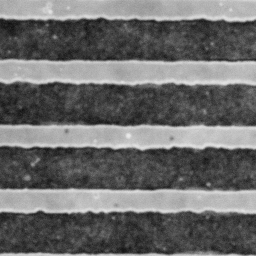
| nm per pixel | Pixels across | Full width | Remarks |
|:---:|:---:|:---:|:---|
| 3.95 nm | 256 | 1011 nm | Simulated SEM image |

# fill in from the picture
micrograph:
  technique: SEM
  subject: lines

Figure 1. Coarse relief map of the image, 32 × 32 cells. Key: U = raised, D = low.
UUUUUUUUUUUUUUUUUUUUUUUUUUUUUUUU
UUUUUUUUUUUUUUUUUUUUUUUUUUUUUUUU
DDDDDDDUDDDDDDDDDDDUUUUDDDUDUUUU
DDDDDDDDDDDDDDDDDDDDDDDDDDDDDDDD
DDDDDDDDDDDDDDDDDDDDDDDDDDDDDDDD
DDDDDDDDDDDDDDDDDDDDDDDDDDDDDDDD
DDDDDDDDDDDDDDDDDDDDDDDDDDDDDDDD
UUUDDDDDDDDDDDDDDDDDDDDDDDDDDDDD
UUUUUUUUUUUUUUUUUUUUUUUUUUUUUUUU
UUUUUUUUUUUUUUUUUUUUUUUUUUUUUUUU
DDDDUDDDDUDDDDUUUUDUDDUUUUUUUDDU
DDDDDDDDDDDDDDDDDDDDDDDDDDDDDDDD
DDDDDDDDDDDDDDDDDDDDDDDDDDDDDDDD
DDDDDDDDDDDDDDDDDDDDDDDDDDDDDDDD
DDDDDDDDDDDDDDDDDDDDDDDDDDDDDDDD
DDDDDDDDDDDDDDDDDDDDDDDDDDDDDDDD
UUUUUUUUUUUUUUUUUUUUUUUUUUUUUUUU
UUUUUUUUUUUUUUUUUUUUUUUUUUUUUUUU
DDDDDDDDDDDDDDUDDUUDUDDDUUDDUUDU
DDDDDDDDDDDDDDDDDDDDDDDDDDDDDDDD
DDDDDDDDDDDDDDDDDDDDDDDDDDDDDDDD
DDDDDDDDDDDDDDDDDDDDDDDDDDDDDDDD
DDDDDDDDDDDDDDDDDDDDDDDDDDDDDDDD
DDDDDDDDDDDDDDDDDDDDDDDDDDDDDDDD
UUUUUUUUUUUUUUUUUUUUUUUUUUUUUUUU
UUUUUUUUUUUUUUUUUUUUUUUUUUUUUUUU
DUUUDDUUUDUDDUDDDDDDUUDDUDDDDDUU
DDDDDDDDDDDDDDDDDDDDDDDDDDDDDDDD
DDDDDDDDDDDDDDDDDDDDDDDDDDDDDDDD
DDDDDDDDDDDDDDDDDDDDDDDDDDDDDDDD
DDDDDDDDDDDDDDDDDDDDDDDDDDDDDDDD
DDDDDDDDDDDDDDDDDDDDDDDDDDDDDDDD